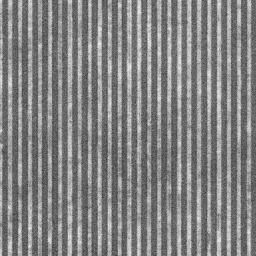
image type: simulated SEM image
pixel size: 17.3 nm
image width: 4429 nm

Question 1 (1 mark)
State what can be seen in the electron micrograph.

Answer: parallel lines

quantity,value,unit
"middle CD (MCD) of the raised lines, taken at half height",47.6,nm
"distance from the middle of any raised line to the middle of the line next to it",0.172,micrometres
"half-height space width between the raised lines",128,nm